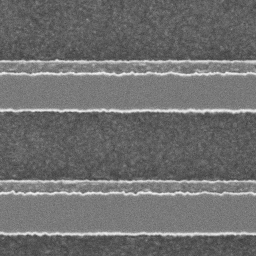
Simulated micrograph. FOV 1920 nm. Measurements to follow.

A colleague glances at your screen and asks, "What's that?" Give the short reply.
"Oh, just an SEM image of lines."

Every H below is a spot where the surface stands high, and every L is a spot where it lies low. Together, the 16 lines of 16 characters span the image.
LLLLLLLLLLLLLLLL
LLLLLLLLLLLLLLLL
LLLLLLLLLLLLLLLL
LLLLLLLLLLLLLLLL
HHHHHHHHHHHHHHHH
HHHHHHHHHHHHHHHH
HHHHHHHHHHHHHHHH
LLLLLLLLLLLLLLLL
LLLLLLLLLLLLLLLL
LLLLLLLLLLLLLLLL
LLLLLLLLLLLLLLLL
HHHHHHHHHHHHHHHH
HHHHHHHHHHHHHHHH
HHHHHHHHHHHHHHHH
HHHHHHHHHHHHHHHH
LLLLLLLLLLLLLLLL